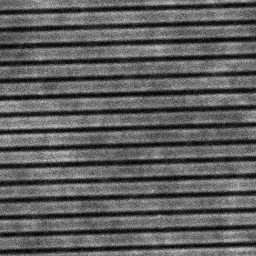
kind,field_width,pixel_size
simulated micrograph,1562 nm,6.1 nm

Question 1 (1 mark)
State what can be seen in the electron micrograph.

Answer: parallel lines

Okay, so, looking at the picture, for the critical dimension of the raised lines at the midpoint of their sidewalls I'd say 67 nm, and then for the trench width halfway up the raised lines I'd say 38.9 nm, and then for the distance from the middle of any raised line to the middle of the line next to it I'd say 0.104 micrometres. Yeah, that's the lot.